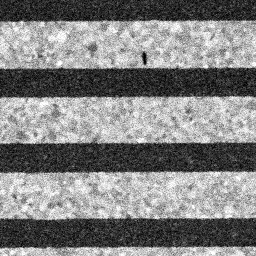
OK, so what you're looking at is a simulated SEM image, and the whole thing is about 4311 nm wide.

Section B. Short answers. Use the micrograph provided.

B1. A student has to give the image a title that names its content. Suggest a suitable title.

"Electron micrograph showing one or a few lines or trenches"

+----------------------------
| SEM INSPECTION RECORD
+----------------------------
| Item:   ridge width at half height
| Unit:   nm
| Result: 770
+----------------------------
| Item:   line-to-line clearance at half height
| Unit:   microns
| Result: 0.49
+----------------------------